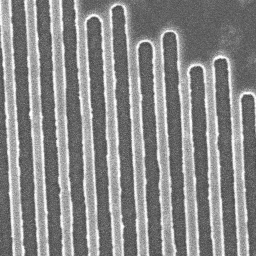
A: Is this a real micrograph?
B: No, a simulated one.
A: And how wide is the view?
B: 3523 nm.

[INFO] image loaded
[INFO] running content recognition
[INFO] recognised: parallel lines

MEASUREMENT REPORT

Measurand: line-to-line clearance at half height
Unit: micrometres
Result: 0.196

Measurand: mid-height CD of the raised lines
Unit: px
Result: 10.5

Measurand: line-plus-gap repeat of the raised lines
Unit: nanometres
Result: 344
